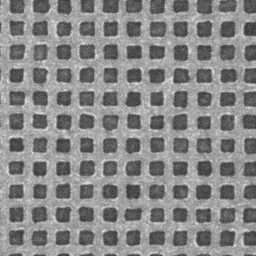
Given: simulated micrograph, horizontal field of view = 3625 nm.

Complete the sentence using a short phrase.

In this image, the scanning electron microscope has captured a regular array of holes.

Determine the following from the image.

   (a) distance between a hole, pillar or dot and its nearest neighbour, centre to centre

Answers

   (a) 325 nm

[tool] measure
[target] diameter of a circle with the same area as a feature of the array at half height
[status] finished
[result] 243 nanometers